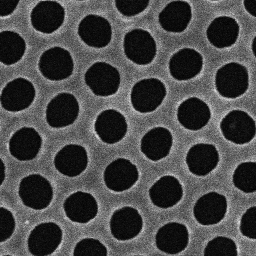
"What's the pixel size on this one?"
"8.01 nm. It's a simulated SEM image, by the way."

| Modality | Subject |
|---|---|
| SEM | a regular array of holes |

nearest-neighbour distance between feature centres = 0.383 microns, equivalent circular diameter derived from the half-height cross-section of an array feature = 0.268 microns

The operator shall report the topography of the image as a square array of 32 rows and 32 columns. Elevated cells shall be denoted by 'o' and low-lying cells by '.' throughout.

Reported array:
..ooo..ooooooo.....oo...oooooo..
..oo....ooooooo...oo....ooooooo.
oooo....oo...ooooooo....ooo..ooo
oooo...ooo....oooooo...ooo....oo
...ooooooo....oo...ooooooo....oo
...oooooooo..oo....oooooooo..ooo
...ooo..oooooooo....oo...ooooooo
..ooo....ooooooo...oo....ooooooo
ooooo....oo...ooooooo....ooo...o
ooooo....oo....oooooo...ooo....o
o...ooooooo....oo...ooooooo....o
....oooooooo..oo.....oooooo....o
....oo....oooooo....ooo..ooooooo
...ooo....ooooooo...oo....oooooo
oooooo....oo...ooooooo....oo...o
oooooo...ooo....ooooooo...oo....
oo...ooooooo....oo...ooooooo....
o....oooooooo..ooo....oooooo...o
o....ooo..oooooooo...ooo...ooooo
oo...oo....ooooooo...oo....ooooo
.oooooo....ooo...oooooo....ooo..
.oooooo...ooo....ooooooo..ooo...
ooo...ooooooo....ooo..ooooooo...
oo.....ooooooo..ooo....ooooooo..
oo.....oo...ooooooo....oo...oooo
ooo...oo....ooooooo...oo....oooo
.ooooooo....oo...ooooooo....ooo.
..ooooooo..ooo....ooooooo...oo..
..oo....oooooo....oo...ooooooo..
.ooo....oooooo...oo.....ooooooo.
ooo....ooo...oooooo....ooo...ooo
oooo...oo....ooooooo...oo.....oo